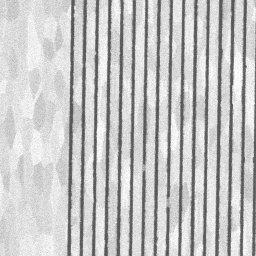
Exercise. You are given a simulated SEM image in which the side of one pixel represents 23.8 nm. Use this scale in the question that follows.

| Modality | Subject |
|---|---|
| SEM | parallel lines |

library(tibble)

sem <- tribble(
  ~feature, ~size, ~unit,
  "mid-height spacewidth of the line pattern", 0.0832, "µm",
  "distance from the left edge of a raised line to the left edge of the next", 293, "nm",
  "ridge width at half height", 205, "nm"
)